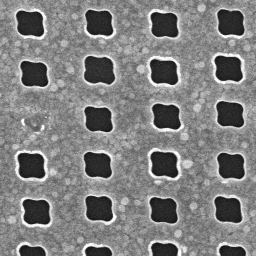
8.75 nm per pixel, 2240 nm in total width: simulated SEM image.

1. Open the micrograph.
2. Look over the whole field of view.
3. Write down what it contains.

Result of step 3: a regular array of holes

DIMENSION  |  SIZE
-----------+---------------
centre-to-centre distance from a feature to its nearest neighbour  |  45.9 px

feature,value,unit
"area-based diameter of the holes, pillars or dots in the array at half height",0.249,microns